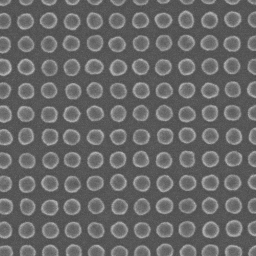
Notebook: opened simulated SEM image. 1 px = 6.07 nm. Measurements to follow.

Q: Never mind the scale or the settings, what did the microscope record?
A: a regular array of raised bodies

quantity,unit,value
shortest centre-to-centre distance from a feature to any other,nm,135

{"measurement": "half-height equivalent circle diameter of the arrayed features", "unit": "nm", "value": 95.5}